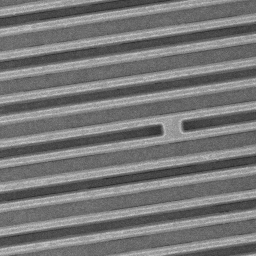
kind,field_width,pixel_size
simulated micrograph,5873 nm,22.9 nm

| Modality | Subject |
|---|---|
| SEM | parallel lines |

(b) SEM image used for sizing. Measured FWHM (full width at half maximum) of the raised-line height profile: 0.179 um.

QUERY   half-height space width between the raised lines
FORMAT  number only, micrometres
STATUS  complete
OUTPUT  0.374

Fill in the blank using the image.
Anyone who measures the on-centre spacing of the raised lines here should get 497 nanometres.